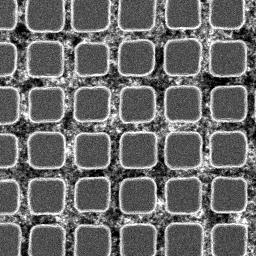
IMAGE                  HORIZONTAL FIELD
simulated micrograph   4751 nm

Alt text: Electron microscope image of a regular array of raised bodies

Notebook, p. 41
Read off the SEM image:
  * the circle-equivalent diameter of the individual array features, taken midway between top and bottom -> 0.718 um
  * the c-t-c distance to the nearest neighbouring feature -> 839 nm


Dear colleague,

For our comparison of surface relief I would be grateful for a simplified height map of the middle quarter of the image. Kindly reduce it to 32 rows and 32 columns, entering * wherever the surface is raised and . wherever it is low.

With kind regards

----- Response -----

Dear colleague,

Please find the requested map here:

...********...********...*******
...********...********...*******
...*******....*******.....******
................................
................................
................................
....*******....*******....******
...*********..*********..*******
...********...*********..*******
...********...*********..*******
...********...*********..*******
...********...*********..*******
...********...*********..*******
...********...********....******
...............**...............
................................
................................
....**.........*******....******
...********...*********...******
...********...*********...******
...********...*********..*******
...********...*********..*******
...********...*********..*******
...********...*********..*******
...********...*********...******
....*******....*******....******
................................
................................
...............................*
...********....********...******
...********...*********...******
...********...*********...******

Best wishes